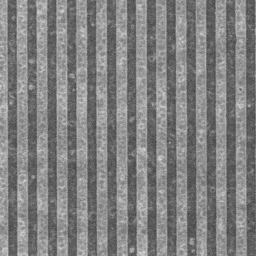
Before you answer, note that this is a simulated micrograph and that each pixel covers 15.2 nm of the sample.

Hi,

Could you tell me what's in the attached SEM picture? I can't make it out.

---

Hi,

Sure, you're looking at parallel lines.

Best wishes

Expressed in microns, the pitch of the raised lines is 0.302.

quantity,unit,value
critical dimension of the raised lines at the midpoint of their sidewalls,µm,0.143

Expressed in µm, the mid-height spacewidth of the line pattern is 0.16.